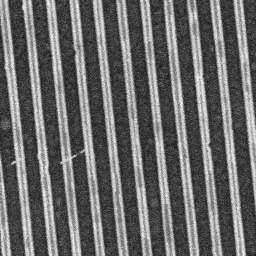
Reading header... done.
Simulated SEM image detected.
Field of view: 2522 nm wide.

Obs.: parallel lines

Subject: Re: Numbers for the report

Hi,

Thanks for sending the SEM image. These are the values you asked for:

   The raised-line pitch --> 230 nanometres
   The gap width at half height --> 165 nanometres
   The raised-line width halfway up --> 61.2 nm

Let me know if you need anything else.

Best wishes